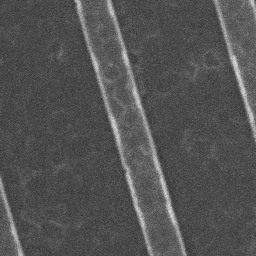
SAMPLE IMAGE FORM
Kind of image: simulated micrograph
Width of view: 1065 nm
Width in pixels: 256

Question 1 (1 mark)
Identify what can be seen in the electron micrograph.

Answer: one or a few lines or trenches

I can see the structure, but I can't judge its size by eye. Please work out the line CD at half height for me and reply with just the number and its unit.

32.6 px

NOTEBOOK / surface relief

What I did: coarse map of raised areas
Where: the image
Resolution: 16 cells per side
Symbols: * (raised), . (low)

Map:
.....**.......**
.....**.......**
.....***......**
......**......**
......**.......*
......**.......*
.......**......*
.......**.......
.......**.......
........**......
........**......
........**......
........***.....
*........**.....
*........**.....
*........**.....